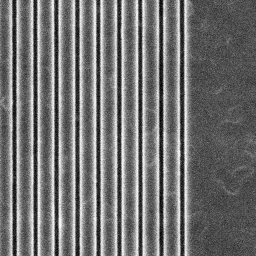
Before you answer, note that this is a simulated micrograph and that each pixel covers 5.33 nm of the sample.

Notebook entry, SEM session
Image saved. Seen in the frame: parallel lines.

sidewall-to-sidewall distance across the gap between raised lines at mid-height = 25.3 nm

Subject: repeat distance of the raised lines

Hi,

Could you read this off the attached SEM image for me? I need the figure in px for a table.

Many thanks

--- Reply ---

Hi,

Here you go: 21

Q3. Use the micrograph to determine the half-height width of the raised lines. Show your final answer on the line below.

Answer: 85.3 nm